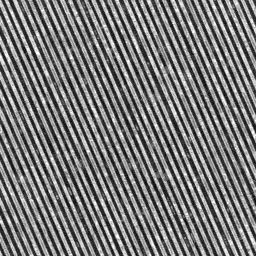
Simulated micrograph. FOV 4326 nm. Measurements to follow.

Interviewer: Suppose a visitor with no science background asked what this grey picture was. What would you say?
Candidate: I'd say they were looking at parallel lines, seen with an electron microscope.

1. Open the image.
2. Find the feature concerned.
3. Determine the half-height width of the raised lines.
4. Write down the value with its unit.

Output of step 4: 48.4 nanometers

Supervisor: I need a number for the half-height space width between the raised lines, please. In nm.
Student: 75.6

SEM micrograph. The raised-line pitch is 0.122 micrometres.